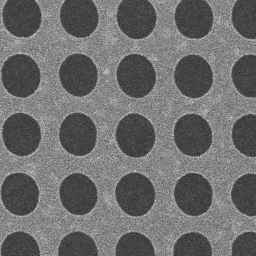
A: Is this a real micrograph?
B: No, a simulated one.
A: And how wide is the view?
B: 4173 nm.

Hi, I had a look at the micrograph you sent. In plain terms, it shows a regular array of holes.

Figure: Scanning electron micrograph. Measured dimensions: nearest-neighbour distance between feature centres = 57.4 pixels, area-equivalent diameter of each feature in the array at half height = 677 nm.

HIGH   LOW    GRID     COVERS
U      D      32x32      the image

UDDDDUUUDDDDUUUDDDDUUUDDDDUUUDDD
DDDDDUUUDDDDUUUDDDDUUUDDDDDUUDDD
DDDDDUUUDDDDUUUDDDDDUUDDDDDUUDDD
UDDDDUUUDDDDUUUDDDDUUUDDDDUUUDDD
UUDDUUUUUDDUUUUUDDDUUUUDDDUUUUDD
UUUUUUUUUUUUUUUUUUUUUUUUUUUUUUUU
UUUUUUUUUUUUUUUUUUUUUUUUUUUUUUUU
UDDDUUUUDDDUUUUDDDDUUUUDDDUUUUDD
DDDDDUUDDDDDUUUDDDDUUUDDDDUUUDDD
DDDDDUUDDDDDUUUDDDDUUUDDDDDUUDDD
DDDDDUUUDDDDUUUDDDDUUUDDDDDUUDDD
UDDDUUUUDDDUUUUDDDDUUUUDDDUUUUDD
UUUUUUUUUUUUUUUUUUUUUUUUUUUUUUUU
UUUUUUUUUUUUUUUUUUUUUUUUUUUUUUUU
UDDDUUUUDDDUUUUUDDUUUUUDDUUUUUDD
DDDDDUUUDDDDUUUDDDDUUUDDDDUUUDDD
DDDDDUUDDDDDUUDDDDDUUUDDDDUUUDDD
DDDDDUUDDDDDUUDDDDDUUUDDDDDUUDDD
UDDDDUUUDDDDUUUDDDDUUUDDDDUUUDDD
UUUUUUUUUUUUUUUUDDUUUUUDDUUUUUUD
UUUUUUUUUUUUUUUUUUUUUUUUUUUUUUUU
UUUUUUUUUUUUUUUUUUUUUUUUUUUUUUUU
UDDDUUUUDDDUUUUDDDDUUUDDDDUUUDDD
DDDDDUUDDDDDUUDDDDDUUUDDDDUUUDDD
DDDDDUUDDDDDUUDDDDDUUUDDDDDUUDDD
DDDDDUUUDDDDUUUDDDDUUUDDDDUUUDDD
UDDDUUUUUDDUUUUUDDDUUUUDDDUUUUDD
UUUUUUUUUUUUUUUUUUUUUUUUUUUUUUUU
UUUUUUUUUUUUUUUUUUUUUUUUUUUUUUUU
UDDDUUUUDDDUUUUDDDUUUUUDDDUUUUDD
DDDDDUUDDDDDUUUDDDDUUUDDDDUUUDDD
DDDDDUUDDDDDUUDDDDDUUUDDDDDUUDDD